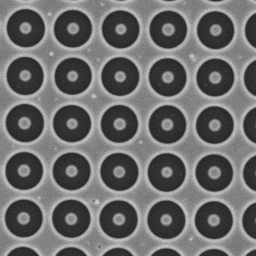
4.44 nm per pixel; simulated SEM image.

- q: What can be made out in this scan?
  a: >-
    an array of small figures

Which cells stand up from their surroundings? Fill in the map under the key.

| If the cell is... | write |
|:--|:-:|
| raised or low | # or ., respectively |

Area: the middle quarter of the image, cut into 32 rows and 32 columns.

.......###........####........##
.......##..........##.........##
.##....##....##....##....##....#
.##....##....##....##....##....#
.......##..........##..........#
......###..........##.........##
......####........####........##
....#######......######......###
#########################..#####
################################
....#######.....########....####
......####.......#####.......###
......####........####........##
.......##.........###..........#
.##....##....##....##....##....#
.##....##....##....##....##....#
.......##..........##..........#
......####........###.........##
.....#####.......#####........##
....#######.....#######.....####
################################
################################
.....######.....#######.....####
......####.......#####.......###
......###.........###.........##
.......##..........##.........##
.##....##....##....##....##....#
.##....##....##....##....##....#
.......##..........##..........#
......###.........###.........##
.....#####........####.......###
....########....#######.....####